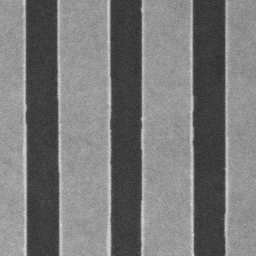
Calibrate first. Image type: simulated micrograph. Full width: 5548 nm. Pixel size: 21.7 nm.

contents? lines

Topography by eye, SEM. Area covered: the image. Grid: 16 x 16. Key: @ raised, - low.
@@--@@@--@@@--@@
@@--@@@--@@@--@@
@@--@@@--@@@--@@
@@--@@@--@@@--@@
@@--@@@--@@@--@@
@@--@@@--@@@--@@
@@--@@@--@@@--@@
@@--@@@--@@@--@@
@@--@@@--@@@--@@
@@--@@@--@@@--@@
@@--@@@--@@@--@@
@@--@@@--@@@--@@
@@--@@@--@@@--@@
@@--@@@--@@@--@@
@@--@@@--@@@--@@
@@--@@@--@@@--@@